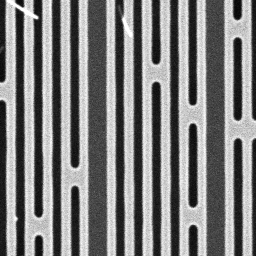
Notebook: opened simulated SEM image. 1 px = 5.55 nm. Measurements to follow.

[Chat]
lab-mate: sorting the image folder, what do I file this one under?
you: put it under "groups of lines, slits or small figures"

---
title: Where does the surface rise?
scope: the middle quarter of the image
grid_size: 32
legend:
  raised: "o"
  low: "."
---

o...oo.....oo..oo...oooooo...oo.
o...oo.....oo..oo...oooooo...oo.
o...oo.....oo..oo...oooooo...oo.
o...oo.....oo..oo...oooooo...oo.
o...oo.....oo..oo...oo..oo...oo.
o...oo.....oo..oo...oo..oo...oo.
o...oo.....oo..oo...oo..oo...oo.
o...oo.....oo..oo...oo..oo...oo.
o...oo.....oo..oo...oo..oo...oo.
o...oo.....oo..oo...oo..oo...oo.
o...oo.....oo..oo...oo..oo...ooo
o...oo.....oo..oo...oo..oo...ooo
o...oo.....oo..oo...oo..oo...ooo
o...oo.....oo..oo...oo..oo...ooo
o...oo.....oo..oo...oo..oo...ooo
o...oo.....oo..oo...oo..oo...oo.
o...oo.....oo..oo...oo..oo...oo.
o...oo.....oo..oo...oo..oo...oo.
o...oo.....oo..oo...oo..oo...oo.
o...oo.....oo..oo...oo..oo...oo.
o...oo.....oo..oo...oo..oo...oo.
o...oo.....oo..oo...oo..oo...oo.
o...oo.....oo..oo...oo..oo...oo.
o...oo.....oo..oo...oo..oo...oo.
o...oo.....oo..oo...oo..oo...oo.
oo..oo.....oo..oo...oo..oo...oo.
oooooo.....oo..oo...oo..oo...oo.
oooooo.....oo..oo...oo..ooo..oo.
oooooo.....oo..oo...oo..ooo..oo.
oooooo.....oo..oo...oo..ooo..oo.
oo.ooo.....oo..oo...oo..ooo..oo.
oo..oo.....oo..oo...oo..ooo..oo.